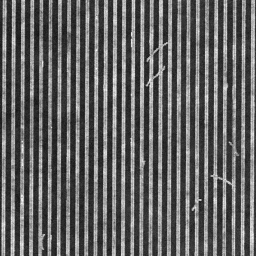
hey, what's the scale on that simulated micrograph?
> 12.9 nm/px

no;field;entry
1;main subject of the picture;parallel lines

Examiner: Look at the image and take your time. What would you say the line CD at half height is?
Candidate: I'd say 0.0322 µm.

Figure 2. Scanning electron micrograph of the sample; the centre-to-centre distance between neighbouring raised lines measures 119 nm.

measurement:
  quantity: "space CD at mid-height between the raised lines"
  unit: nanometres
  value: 87